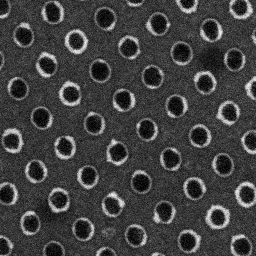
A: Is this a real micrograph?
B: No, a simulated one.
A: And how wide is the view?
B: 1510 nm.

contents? a regular array of raised bodies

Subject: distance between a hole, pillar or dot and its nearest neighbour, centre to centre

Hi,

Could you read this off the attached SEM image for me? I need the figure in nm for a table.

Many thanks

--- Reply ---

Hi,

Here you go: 218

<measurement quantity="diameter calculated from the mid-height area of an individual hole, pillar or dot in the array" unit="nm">131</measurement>